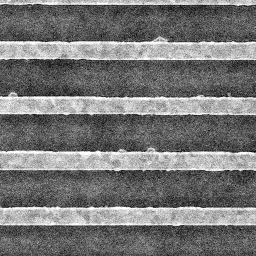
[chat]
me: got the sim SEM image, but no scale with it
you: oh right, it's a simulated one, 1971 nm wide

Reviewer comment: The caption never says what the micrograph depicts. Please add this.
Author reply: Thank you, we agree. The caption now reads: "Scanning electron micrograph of lines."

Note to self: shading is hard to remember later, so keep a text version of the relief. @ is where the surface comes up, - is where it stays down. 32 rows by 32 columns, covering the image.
-----------------------------@@@
--------------------------------
--------------------------------
--------------------------------
--------------------------------
@@@@@@@@@@@@@@@@@@@@@@@@@@@@@@@@
@@@@@@@@@@@@@@@@@@@@@@@@@@@@@@@@
--------------------------------
--------------------------------
--------------------------------
--------------------------------
--------------------------------
@@@@@@@@@@@@@@@@@@@@@@@@@@@@@@@@
@@@@@@@@@@@@@@@@@@@@@@@@@@@@@@@@
--------------------------------
--------------------------------
--------------------------------
--------------------------------
--------------------------------
@@@@@@@@@@@@@@@@@@@@@@@@@@@@@@@@
@@@@@@@@@@@@@@@@@@@@@@@@@@@@@@@@
--------------------------------
--------------------------------
--------------------------------
--------------------------------
--------------------------------
@@@@@@@@@@@@@@@@@@@@@@@@@@@@@@@@
@@@@@@@@@@@@@@@@@@@@@@@@@@@@@@@@
--------------------------------
--------------------------------
--------------------------------
--------------------------------